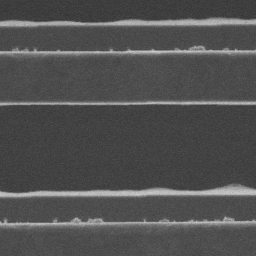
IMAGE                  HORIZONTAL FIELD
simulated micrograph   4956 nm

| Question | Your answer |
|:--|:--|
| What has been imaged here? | lines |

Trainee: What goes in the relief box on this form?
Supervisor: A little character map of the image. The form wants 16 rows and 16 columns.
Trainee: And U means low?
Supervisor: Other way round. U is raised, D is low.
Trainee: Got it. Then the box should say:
DDDDDDDDDDDDDDDD
DDDDDDDDDDDDDUUU
UUUUUUUUUUUUUUUU
UUUUUUUUUUUUUUUU
UUUUUUUUUUUUUUUU
UUUUUUUUUUUUUUUU
DDDDDDDDDDDDDDDD
DDDDDDDDDDDDDDDD
DDDDDDDDDDDDDDDD
DDDDDDDDDDDDDDDD
DDDDDDDDDDDDDDDD
DDDDDDDDDDDDDDDD
UUUUUUUUUUUUUUUU
UUUUUUUUUUUUUUUU
UUUUUUUUUUUUUUUU
UUUUUUUUUUUUUUUU